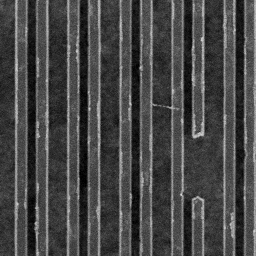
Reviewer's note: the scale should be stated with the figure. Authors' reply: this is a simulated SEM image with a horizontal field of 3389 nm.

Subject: parallel lines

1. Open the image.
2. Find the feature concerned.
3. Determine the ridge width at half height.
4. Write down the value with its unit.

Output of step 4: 146 nm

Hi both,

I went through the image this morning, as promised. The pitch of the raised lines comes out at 338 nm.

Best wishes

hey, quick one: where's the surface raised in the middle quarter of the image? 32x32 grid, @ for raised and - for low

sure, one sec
-@@@--@@@-----@@@--@@@-----@@@--
-@@@--@@@-----@@@--@@@-----@@@--
-@@@--@@@-----@@@--@@@-----@@@--
-@@@--@@@-----@@@--@@@-----@@@--
-@@@--@@@-----@@@--@@@-----@@@--
-@@@--@@@-----@@@--@@@-----@@@--
-@@@--@@@-----@@@--@@@-----@@@--
-@@@--@@@-----@@@--@@@-----@@@--
-@@@--@@@-----@@@--@@@-----@@@--
-@@@--@@@-----@@@--@@@-----@@@--
-@@@--@@@-----@@@--@@@-----@@@--
-@@@--@@@-----@@@--@@@-----@@@--
-@@@--@@@-----@@@--@@@-----@@@--
-@@@--@@@-----@@@--@@@-----@@@--
-@@@--@@@-----@@@--@@@-----@@@--
-@@---@@@-----@@@--@@@-----@@@--
-@@---@@@-----@@@--@@@-----@@@--
-@@---@@@-----@@@--@@@-----@@@--
-@@---@@@-----@@@--@@@-----@@@--
-@@---@@@-----@@@--@@@-----@@@--
-@@---@@@-----@@@--@@@-----@@@--
-@@---@@@-----@@@--@@@-----@@@--
-@@---@@@-----@@@--@@@-----@@@--
-@@---@@@-----@@@--@@@-----@@@--
-@@---@@@-----@@@--@@@-----@@@--
-@@---@@@-----@@@--@@@-----@@@--
-@@---@@@-----@@@--@@@-----@@@--
-@@---@@@-----@@@--@@@-----@@@--
-@@@--@@@-----@@@--@@@-----@@@--
-@@@--@@@-----@@@--@@@-----@@@--
-@@@--@@@-----@@@--@@@-----@@@--
-@@@--@@@-----@@@--@@@-----@@@--